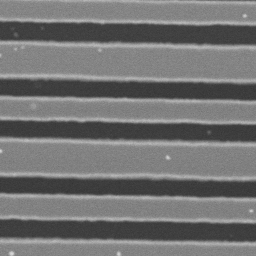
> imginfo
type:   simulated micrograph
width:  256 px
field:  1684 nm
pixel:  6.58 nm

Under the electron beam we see lines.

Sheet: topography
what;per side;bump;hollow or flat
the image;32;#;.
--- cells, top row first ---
################################
################################
################################
................................
................................
######################..........
################################
################################
################################
################################
................................
................................
#############################...
################################
################################
................................
................................
#############...................
################################
################################
################################
################################
................................
................................
###################.#...........
################################
################################
...........#.###################
................................
................................
################################
################################